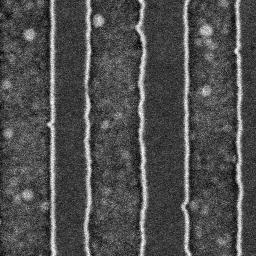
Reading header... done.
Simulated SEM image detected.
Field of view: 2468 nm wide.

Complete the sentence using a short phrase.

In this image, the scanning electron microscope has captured one or a few lines or trenches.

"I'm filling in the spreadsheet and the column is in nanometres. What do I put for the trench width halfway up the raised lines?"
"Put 512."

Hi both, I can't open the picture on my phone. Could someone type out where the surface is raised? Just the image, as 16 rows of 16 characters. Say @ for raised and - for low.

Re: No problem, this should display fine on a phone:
---@@@---@@@---@
---@@@---@@@---@
---@@@---@@@---@
---@@@---@@@---@
---@@----@@@---@
---@@----@@@---@
---@@----@@@---@
---@@----@@@---@
---@@----@@@---@
---@@@---@@@---@
---@@@---@@@---@
---@@@---@@@---@
---@@@---@@@---@
---@@----@@@---@
---@@----@@@---@
---@@@---@@@---@